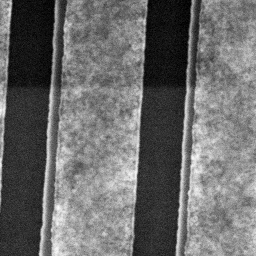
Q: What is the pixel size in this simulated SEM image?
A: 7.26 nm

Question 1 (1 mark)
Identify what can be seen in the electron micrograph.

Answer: lines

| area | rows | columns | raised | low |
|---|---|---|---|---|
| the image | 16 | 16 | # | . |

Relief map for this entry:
#..######...####
#..######...####
#..######...####
...######...####
...######...####
...######...####
...######...####
...######...####
...######..#####
...######..#####
...######..#####
...######..#####
...#####...#####
...#####...#####
...#####...#####
...#####...#####